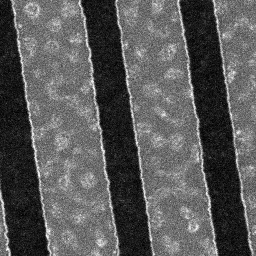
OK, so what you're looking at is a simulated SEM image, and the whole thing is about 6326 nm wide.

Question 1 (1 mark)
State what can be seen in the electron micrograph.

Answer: one or a few lines or trenches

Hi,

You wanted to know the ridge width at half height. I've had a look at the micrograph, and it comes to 0.874 um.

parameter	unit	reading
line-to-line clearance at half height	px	62.9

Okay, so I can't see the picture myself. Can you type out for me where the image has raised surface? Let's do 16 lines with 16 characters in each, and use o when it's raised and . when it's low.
o....oo....oo...
o....oo....ooo..
o....ooo....oo..
o.....oo....oo..
o.....oo....oo..
oo....oo....oo..
oo....oo....oo..
oo....oo....ooo.
oo....ooo...ooo.
oo....ooo....oo.
oo.....oo....oo.
ooo....oo....oo.
ooo....oo....oo.
ooo....oo....oo.
ooo....oo....ooo
ooo....ooo...ooo